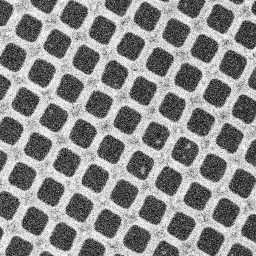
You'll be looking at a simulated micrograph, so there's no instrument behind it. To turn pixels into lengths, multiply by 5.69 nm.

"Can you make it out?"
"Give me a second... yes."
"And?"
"a regular array of holes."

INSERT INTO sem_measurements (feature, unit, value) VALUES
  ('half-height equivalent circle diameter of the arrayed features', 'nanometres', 156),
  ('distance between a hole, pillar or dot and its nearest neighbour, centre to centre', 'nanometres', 186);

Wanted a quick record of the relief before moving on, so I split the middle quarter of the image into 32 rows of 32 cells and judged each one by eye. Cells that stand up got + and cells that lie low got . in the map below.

++......++.....+++++.......++...
++++...+++......+++++.....+++...
..+++..++.......+++++++...++....
...++++++.......++..++++++++....
.....++++......++.....++++++....
.....++++++....++......+++++....
.....+++.++++.++.......+++++++..
....+++....+++++.......+++..++++
....++......+++++.....+++.....++
+..+++......++++++....++.......+
+++++.......+++.++++++++.......+
+++++.......++....+++++.......++
.+++++.....++......+++++......++
.+++++++..+++......++++++....++.
.++...++++++.......+++.++++..++.
++......++++......+++.....+++++.
++......++++++....++......+++++.
+.......+++++++..+++.......+++++
+.......++...++++++.......+++..+
++.....++......+++++......++....
++++...++......++++++....+++....
..++++++.......+++.+++..+++.....
...+++++.......++...+++++++.....
....+++++.....+++.....+++++.....
....+++++++...++.......+++++....
....++...++++++.......+++.++++..
...++......++++.......++....++++
...++......+++++.....+++.....+++
++++.......+++++++...++.......++
++++.......++...+++++++......+++
+++++.....+++.....+++++......++.
+++++++...++.......+++++.....++.